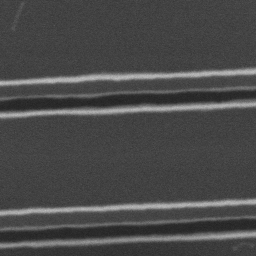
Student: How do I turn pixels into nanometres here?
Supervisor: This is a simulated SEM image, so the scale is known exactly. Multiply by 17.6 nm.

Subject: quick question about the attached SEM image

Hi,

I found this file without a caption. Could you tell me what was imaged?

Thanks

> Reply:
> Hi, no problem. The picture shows lines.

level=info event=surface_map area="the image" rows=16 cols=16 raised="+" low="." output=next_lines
................
................
................
................
................
++++++++++++++++
+++++++++++++++.
................
................
................
................
................
................
++++++++++++++++
++++++++++++++++
................